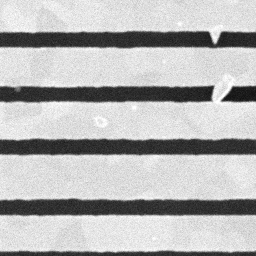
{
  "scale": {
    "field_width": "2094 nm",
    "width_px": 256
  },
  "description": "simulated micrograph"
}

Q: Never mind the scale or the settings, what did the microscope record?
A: lines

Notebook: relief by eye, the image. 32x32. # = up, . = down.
################################
################################
################################
################################
..........................#.....
................................
################################
################################
################################
################################
################################
...........................##...
..........................##....
################################
################################
################################
################################
................................
................................
################################
################################
################################
################################
################################
################################
................................
................................
################################
################################
################################
################################
................................